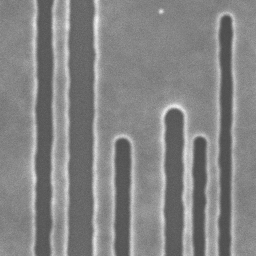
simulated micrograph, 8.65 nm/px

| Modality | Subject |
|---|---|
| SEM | groups of lines, slits or small figures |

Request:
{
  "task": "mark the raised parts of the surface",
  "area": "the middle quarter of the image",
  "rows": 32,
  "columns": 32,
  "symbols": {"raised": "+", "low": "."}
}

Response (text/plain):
+.......++++++++++++++++++++++++
+.......++++++++++++++++++++++++
+.......++++++++++++++++++++++++
+.......++++++++++++++++++++++++
+.......++++++++++++++++++++++++
+.......++++++++++++++++++++++++
+.......++++++++++++++++++++++++
+.......++++++++++++++++++++++++
+.......++++++++++++++++++++++++
+.......++++++++++++++++++++++++
+.......++++++++++++++++++++++++
+.......++++++++++++++++++...+++
+.......+++++++++++++++++.....++
+.......+++++++++++++++++.....++
+.......+++++++++++++++++.....++
+.......+++++++++++++++++.....++
+.......+++++++++++++++++.....++
+.......+++++++++++++++++.....++
+.......++++++.++++++++++.....++
+.......+++++....++++++++.....++
+.......+++++....++++++++.....++
+.......+++++....++++++++.....++
+.......+++++....++++++++.....++
+.......+++++....++++++++.....++
+.......+++++....++++++++.....++
+.......+++++....++++++++.....++
+.......+++++....++++++++.....++
+.......+++++....++++++++.....++
+.......+++++....++++++++.....++
+.......++++.....++++++++.....++
+.......+++++....++++++++.....++
+.......+++++....++++++++.....++